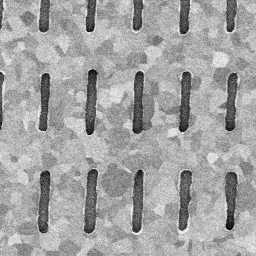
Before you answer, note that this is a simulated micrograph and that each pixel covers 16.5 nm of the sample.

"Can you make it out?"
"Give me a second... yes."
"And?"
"a regular array of holes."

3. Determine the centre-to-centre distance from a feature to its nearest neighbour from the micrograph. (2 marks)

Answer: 766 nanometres